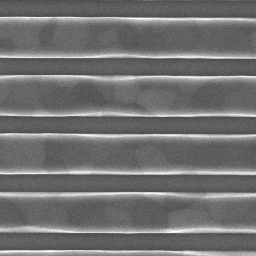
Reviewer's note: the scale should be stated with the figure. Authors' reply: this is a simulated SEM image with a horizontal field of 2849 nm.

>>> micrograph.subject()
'wiring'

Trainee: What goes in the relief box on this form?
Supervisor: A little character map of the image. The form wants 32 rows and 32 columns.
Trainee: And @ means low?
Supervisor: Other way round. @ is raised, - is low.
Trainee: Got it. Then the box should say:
--------------------------------
--------------------------------
@@@@@@@@@@@@@@@@@@@@@@@@@@@@@@@@
@@@@@@@@@@@@@@@@@@@@@@@@@@@@@@@@
@@@@@@@@@@@@@@@@@@@@@@@@@@@@@@@@
@@@@@@@@@@@@@@@@@@@@@@@@@@@@@@@@
@@@@@@@@@@@@@@@@@@@@@@@@@@@@@@@@
--------------------------------
--------------------------------
--@@@@@@@-----------------------
@@@@@@@@@@@@@@@@@@@@@@@@@@@@@@@@
@@@@@@@@@@@@@@@@@@@@@@@@@@@@@@@@
@@@@@@@@@@@@@@@@@@@@@@@@@@@@@@@@
@@@@@@@@@@@@@@@@@@@@@@@@@@@@@@@@
--------------------------------
--------------------------------
--------------------------------
@@@@@@@@@@@@@@@@@@@@@@@@@@@@@@@@
@@@@@@@@@@@@@@@@@@@@@@@@@@@@@@@@
@@@@@@@@@@@@@@@@@@@@@@@@@@@@@@@@
@@@@@@@@@@@@@@@@@@@@@@@@@@@@@@@@
@@@@@@@@@@@@@@@@@@@@@@@@@@@@@@@@
--------------------------------
--------------------------------
@@@@@@@@@@@@@@@@@@@@@@@@@@@@@@@@
@@@@@@@@@@@@@@@@@@@@@@@@@@@@@@@@
@@@@@@@@@@@@@@@@@@@@@@@@@@@@@@@@
@@@@@@@@@@@@@@@@@@@@@@@@@@@@@@@@
@@@@@@@@@@@@@@@@@@@@@@@@@@@@@@@@
--------------------------------
--------------------------------
@@@@@@@@@@@@@@@@@@@@@@----------